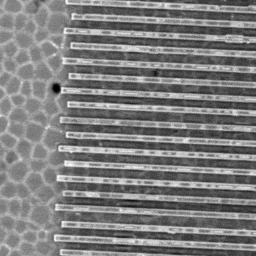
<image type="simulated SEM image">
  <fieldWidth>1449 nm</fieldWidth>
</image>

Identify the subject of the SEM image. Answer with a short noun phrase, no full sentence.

parallel lines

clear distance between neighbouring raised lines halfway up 55.1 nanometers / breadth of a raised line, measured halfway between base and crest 30.4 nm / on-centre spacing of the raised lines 83.8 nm